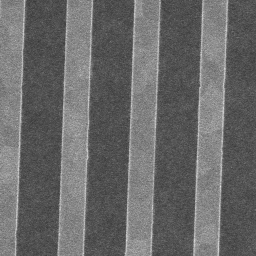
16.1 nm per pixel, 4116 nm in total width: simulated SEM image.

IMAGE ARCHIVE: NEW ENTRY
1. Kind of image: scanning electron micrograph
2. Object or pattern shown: one or a few lines or trenches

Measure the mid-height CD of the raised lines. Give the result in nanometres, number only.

406